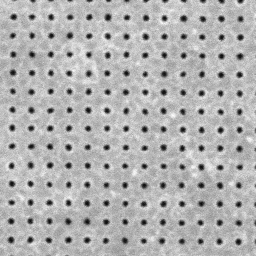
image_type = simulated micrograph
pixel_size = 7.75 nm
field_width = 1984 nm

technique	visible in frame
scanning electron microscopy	a regular array of holes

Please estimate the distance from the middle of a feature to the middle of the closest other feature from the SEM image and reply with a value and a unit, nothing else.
142 nm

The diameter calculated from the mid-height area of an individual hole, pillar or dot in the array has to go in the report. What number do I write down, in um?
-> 0.0539